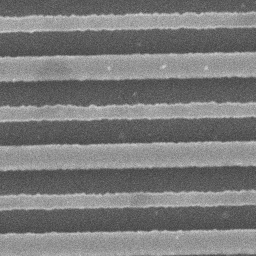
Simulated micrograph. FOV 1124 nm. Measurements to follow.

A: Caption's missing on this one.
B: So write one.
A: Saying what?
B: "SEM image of lines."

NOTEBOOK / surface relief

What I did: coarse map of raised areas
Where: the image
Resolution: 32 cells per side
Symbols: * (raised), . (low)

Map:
................................
................................
********************************
*******************.**..**......
................................
................................
................................
********************************
********************************
*********************.**........
................................
................................
................................
********************************
********************************
................................
................................
................................
********************************
********************************
****************************..**
................................
................................
................................
.*******************************
********************************
................................
................................
................................
********************************
********************************
*************************.......